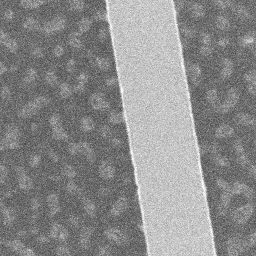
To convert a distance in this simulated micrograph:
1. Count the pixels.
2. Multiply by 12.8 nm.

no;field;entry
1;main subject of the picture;one or a few lines or trenches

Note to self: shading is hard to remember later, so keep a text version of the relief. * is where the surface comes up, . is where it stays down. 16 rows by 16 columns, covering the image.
*******....*****
*******....*****
*******....*****
*******....*****
*******....*****
********....****
********....****
********....****
********....****
********....****
********....****
*********....***
*********....***
*********....***
*********....***
*********....***